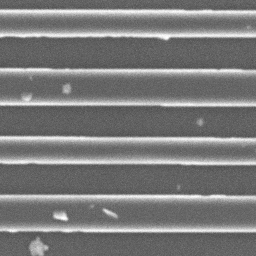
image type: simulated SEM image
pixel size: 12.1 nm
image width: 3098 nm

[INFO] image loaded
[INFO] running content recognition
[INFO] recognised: lines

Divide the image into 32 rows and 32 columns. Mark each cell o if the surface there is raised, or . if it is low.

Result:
................................
oooooooooooooooooooooooooooooooo
oooooooooooooooooooooooooooooooo
oooooooooooooooooooooooooooooooo
..o...............o.ooo....oo..o
................................
................................
................................
................................
oooooooooooooooooooooooooooooooo
oooooooooooooooooooooooooooooooo
oooooooooooooooooooooooooooooooo
oooooooooooooooooooooooooooooooo
................................
................................
................................
................................
oooooooooooooooooooooooooooooooo
oooooooooooooooooooooooooooooooo
oooooooooooooooooooooooooooooooo
................................
................................
................................
................................
ooooooooooooooooooooooooo.oo....
oooooooooooooooooooooooooooooooo
oooooooooooooooooooooooooooooooo
oooooooooooooooooooooooooooooooo
oooooooooooooooooooooooooooooooo
................................
................................
................................